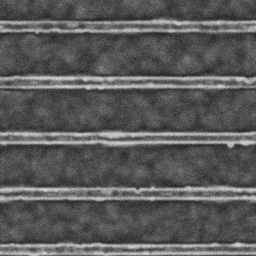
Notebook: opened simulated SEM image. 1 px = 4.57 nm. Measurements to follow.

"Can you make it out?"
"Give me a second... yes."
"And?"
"parallel lines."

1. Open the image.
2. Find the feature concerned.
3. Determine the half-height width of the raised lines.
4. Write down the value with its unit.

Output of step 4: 49.1 nm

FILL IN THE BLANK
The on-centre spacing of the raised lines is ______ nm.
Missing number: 254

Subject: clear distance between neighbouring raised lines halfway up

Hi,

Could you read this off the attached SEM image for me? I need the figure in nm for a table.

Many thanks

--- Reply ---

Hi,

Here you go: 207